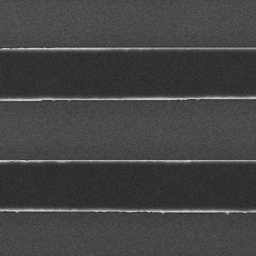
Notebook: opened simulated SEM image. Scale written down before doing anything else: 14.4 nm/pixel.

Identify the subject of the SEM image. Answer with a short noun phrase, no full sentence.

lines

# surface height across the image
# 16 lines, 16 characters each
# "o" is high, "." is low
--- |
................
................
................
oooooooooooooooo
oooooooooooooooo
oooooooooooooooo
................
................
................
................
oooooooooooooooo
oooooooooooooooo
oooooooooooooooo
................
................
................